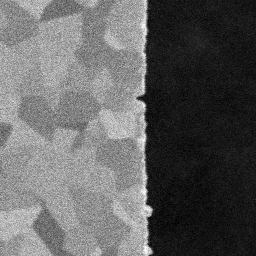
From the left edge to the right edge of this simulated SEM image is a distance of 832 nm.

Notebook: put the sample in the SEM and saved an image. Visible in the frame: one or a few lines or trenches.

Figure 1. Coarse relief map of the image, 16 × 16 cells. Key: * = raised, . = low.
*********.......
*********.......
*********.......
*********.......
*********.......
*********.......
*********.......
*********.......
*********.......
*********.......
*********.......
*********.......
*********.......
*********.......
*********.......
*********.......